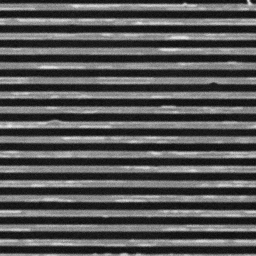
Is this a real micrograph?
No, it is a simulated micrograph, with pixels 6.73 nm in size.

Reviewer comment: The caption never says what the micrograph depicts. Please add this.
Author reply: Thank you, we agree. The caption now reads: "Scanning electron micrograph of parallel lines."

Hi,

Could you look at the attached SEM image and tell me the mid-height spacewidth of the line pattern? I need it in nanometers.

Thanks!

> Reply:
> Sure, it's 60.6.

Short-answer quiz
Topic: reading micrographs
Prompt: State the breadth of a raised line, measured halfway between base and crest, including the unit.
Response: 6.26 px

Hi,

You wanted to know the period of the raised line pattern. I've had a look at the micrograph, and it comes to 99.2 nm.